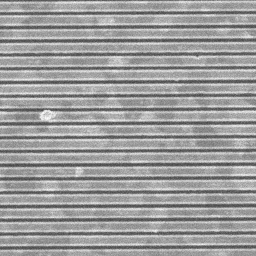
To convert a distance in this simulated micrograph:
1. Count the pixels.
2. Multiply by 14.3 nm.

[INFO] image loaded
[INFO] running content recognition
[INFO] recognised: parallel lines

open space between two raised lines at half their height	69.7	nm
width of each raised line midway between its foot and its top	0.123	microns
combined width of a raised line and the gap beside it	0.197	um